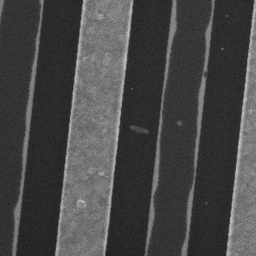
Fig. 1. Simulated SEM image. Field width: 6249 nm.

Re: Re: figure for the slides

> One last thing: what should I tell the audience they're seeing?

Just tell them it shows lines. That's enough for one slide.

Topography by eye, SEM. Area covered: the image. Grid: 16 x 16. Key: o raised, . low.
ooo..ooo...oo...
ooo..ooo...oo...
oo...ooo...oo...
oo...ooo..ooo...
oo...ooo..ooo..o
oo...ooo..ooo..o
oo...ooo..ooo..o
oo..ooo...ooo..o
oo..ooo...oo...o
oo..ooo...oo...o
oo..ooo...oo...o
o...ooo...oo...o
o...ooo..ooo...o
o...ooo..ooo..oo
o...ooo..ooo..oo
o...ooo..ooo..oo